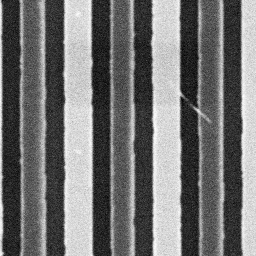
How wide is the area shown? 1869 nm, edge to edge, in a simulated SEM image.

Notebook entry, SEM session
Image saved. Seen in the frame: lines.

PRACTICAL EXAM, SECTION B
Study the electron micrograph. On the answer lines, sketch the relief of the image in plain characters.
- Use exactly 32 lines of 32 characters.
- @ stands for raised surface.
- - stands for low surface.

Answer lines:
---@@---@@@---@@@--@@@---@@@--@@
---@@---@@@---@@@--@@@---@@@--@@
---@@---@@@---@@@--@@@---@@@--@@
---@@---@@@---@@@--@@@---@@@--@@
---@@---@@@---@@@--@@@---@@@--@@
---@@---@@@---@@@--@@@---@@@--@@
---@@---@@@---@@@--@@@---@@@--@@
---@@@--@@@---@@@--@@@---@@@--@@
---@@@--@@@---@@@--@@@---@@@--@@
---@@@--@@@---@@@--@@@---@@@--@@
---@@@--@@@---@@@--@@@---@@@--@@
---@@@--@@@---@@@--@@@@--@@@--@@
---@@@--@@@---@@@--@@@---@@@--@@
---@@---@@@---@@@--@@@---@@@--@@
---@@---@@@---@@@--@@@---@@@--@@
---@@@--@@@---@@@--@@@---@@@--@@
---@@@--@@@---@@@--@@@---@@@--@@
---@@---@@@---@@@--@@@@--@@@--@@
---@@---@@@---@@@--@@@@--@@@--@@
---@@---@@@---@@@--@@@---@@@--@@
---@@---@@@---@@@--@@@@--@@@--@@
---@@---@@@---@@@--@@@@--@@@--@@
---@@@--@@@---@@@--@@@@--@@@--@@
---@@---@@@---@@@--@@@@--@@@--@@
---@@---@@@---@@@--@@@@--@@@--@@
---@@@--@@@---@@@--@@@@--@@@--@@
---@@@--@@@---@@@--@@@@--@@@--@@
---@@@--@@@---@@@--@@@---@@@--@@
---@@@--@@@---@@@--@@@---@@@--@@
---@@@--@@@---@@@--@@@@--@@@--@@
---@@@--@@@---@@@--@@@@--@@@--@@
---@@@--@@@---@@@--@@@@--@@@--@@